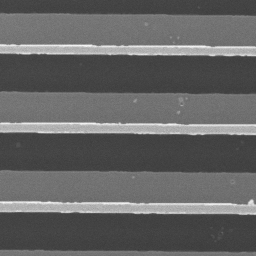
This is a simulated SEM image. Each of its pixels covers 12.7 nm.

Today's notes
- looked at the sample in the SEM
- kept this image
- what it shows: lines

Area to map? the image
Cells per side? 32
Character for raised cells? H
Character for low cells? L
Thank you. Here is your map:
LLLLLLLLLLLLLLLLLLLLLLLLLLLLLLLL
LLLLLLLLLLLLLLLLLLLLLLLLLLLLLLLL
HHHHHHHHHHHHHHHHHHHHHHHHHHHHHHHH
HHHHHHHHHHHHHHHHHHHHHHHHHHHHHHHH
HHHHHHHHHHHHHHHHHHHHHHHHHHHHHHHH
HHHHHHHHHHHHHHHHHHHHHHHHHHHHHHHH
HHHHHHHHHHHHHHHHHHHHHHHHHHHHHHHH
LLLLLLLLLLLLLLLLLLLLLLLLLLLLLLLL
LLLLLLLLLLLLLLLLLLLLLLLLLLLLLLLL
LLLLLLLLLLLLLLLLLLLLLLLLLLLLLLLL
LLLLLLLLLLLLLLLLLLLLLLLLLLLLLLLL
LLLLLLLLLLLLLLLLLLLLLLLLLLLLLLLL
HHHHHHHHHHHHHHHHHHHHHHHHHHHHHHHH
HHHHHHHHHHHHHHHHHHHHHHHHHHHHHHHH
HHHHHHHHHHHHHHHHHHHHHHHHHHHHHHHH
HHHHHHHHHHHHHHHHHHHHHHHHHHHHHHHH
HLLLHHHHHHHHHHHHHHHHHHHHHHHHHHHH
LLLLLLLLLLLLLLLLLLLLLLLLLLLLLLLL
LLLLLLLLLLLLLLLLLLLLLLLLLLLLLLLL
LLLLLLLLLLLLLLLLLLLLLLLLLLLLLLLL
LLLLLLLLLLLLLLLLLLLLLLLLLLLLLLLL
HHHHHHHHHHHHHHHHLHHLLLLLLLLLLLLL
HHHHHHHHHHHHHHHHHHHHHHHHHHHHHHHH
HHHHHHHHHHHHHHHHHHHHHHHHHHHHHHHH
HHHHHHHHHHHHHHHHHHHHHHHHHHHHHHHH
HHHHHHHHHHHHHHHHHHHHHHHHHHHHHHHH
LHLLLLLHHHHHHHHHHHHHHHHHHHHHHHHH
LLLLLLLLLLLLLLLLLLLLLLLLLLLLLLLL
LLLLLLLLLLLLLLLLLLLLLLLLLLLLLLLL
LLLLLLLLLLLLLLLLLLLLLLLLLLLLLLLL
LLLLLLLLLLLLLLLLLLLLLLLLLLLLLLLL
HHHHHHHHHHHHHHHHHHHHHLLLLLLLLLLL